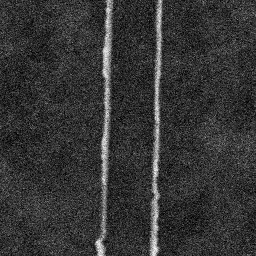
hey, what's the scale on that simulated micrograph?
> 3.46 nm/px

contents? one or a few lines or trenches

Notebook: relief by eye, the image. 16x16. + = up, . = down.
+++++++...++++++
+++++++...++++++
+++++++...++++++
+++++++...++++++
+++++++...++++++
+++++++...++++++
+++++++...++++++
+++++++...++++++
+++++++...++++++
+++++++...++++++
+++++++...++++++
+++++++...++++++
+++++++...++++++
+++++++...++++++
+++++++..+++++++
++++++...+++++++